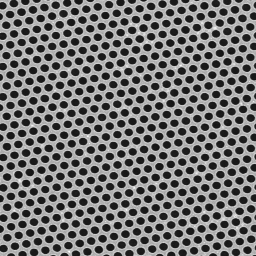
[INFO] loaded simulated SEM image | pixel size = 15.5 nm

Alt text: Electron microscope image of a regular array of holes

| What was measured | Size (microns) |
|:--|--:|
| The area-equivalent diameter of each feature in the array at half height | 0.123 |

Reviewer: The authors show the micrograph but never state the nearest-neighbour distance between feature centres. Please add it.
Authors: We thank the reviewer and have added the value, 0.176 µm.